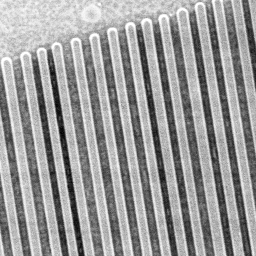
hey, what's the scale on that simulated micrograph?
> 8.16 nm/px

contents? parallel lines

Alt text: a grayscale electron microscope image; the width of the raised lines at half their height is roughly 75.6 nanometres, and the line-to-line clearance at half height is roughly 76.6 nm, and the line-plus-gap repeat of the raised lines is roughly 0.148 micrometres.